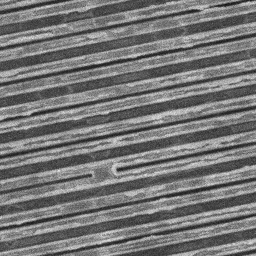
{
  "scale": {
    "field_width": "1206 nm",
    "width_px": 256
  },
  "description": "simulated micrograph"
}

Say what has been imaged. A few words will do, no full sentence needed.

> parallel lines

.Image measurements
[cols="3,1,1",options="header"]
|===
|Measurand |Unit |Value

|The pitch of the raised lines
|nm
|83.7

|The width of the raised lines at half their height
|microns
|0.0457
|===